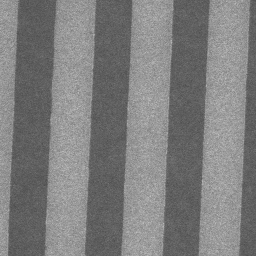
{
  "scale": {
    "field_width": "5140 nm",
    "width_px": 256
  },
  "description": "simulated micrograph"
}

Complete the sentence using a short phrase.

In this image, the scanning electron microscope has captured one or a few lines or trenches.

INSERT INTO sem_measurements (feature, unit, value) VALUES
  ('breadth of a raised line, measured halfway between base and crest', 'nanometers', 800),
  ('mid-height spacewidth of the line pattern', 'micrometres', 0.745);